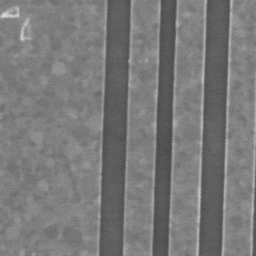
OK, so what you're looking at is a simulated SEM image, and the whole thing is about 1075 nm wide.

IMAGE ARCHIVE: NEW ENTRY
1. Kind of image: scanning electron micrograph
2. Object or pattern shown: parallel lines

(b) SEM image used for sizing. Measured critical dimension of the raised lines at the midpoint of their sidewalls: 0.122 um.